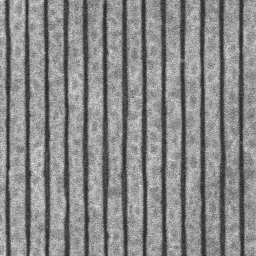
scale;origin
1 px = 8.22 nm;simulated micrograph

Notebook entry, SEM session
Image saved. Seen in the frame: parallel lines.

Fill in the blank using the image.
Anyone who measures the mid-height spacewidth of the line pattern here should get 37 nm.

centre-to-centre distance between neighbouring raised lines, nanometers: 160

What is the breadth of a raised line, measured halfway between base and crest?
125 nm